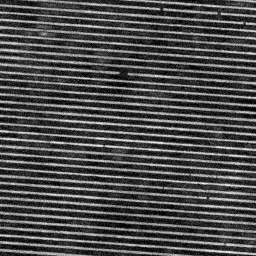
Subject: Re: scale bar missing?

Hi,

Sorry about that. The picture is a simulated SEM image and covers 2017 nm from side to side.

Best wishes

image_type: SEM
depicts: parallel lines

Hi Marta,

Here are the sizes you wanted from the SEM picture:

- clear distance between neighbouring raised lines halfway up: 44.2 nanometres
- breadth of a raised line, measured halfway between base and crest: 0.0128 microns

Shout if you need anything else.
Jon